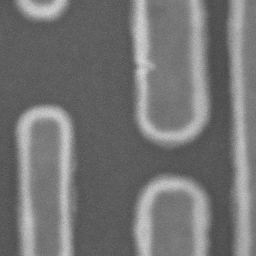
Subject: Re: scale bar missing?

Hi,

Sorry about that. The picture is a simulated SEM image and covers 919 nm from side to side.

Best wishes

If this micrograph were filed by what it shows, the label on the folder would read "one or a few lines or trenches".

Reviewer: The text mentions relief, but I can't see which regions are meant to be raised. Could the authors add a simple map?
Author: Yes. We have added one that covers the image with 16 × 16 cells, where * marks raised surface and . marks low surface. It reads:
..*......***...*
.........***...*
.........***...*
.........***...*
.........***...*
.........****..*
.........****..*
..**.....***...*
..**...........*
..**...........*
..**...........*
..**......*....*
..**.....***...*
..**.....****..*
..**.....****..*
..**.....****..*